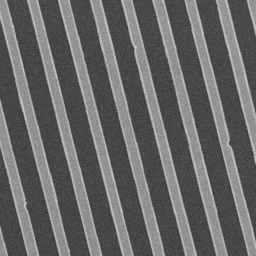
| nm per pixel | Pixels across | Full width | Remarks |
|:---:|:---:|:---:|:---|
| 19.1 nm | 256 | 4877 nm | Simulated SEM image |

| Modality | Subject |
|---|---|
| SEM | parallel lines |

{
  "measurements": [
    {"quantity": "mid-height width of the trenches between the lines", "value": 388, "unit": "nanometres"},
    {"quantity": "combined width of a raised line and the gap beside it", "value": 581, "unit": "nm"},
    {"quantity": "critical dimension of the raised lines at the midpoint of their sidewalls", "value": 194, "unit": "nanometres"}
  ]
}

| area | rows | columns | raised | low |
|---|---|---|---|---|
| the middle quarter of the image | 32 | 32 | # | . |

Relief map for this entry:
...##......##......##......##...
...###.....##......##......##...
...###.....###.....###.....##...
....##.....###.....###.....###..
....##......##......##......##..
....###.....##......##......##..
.....##.....###.....###.....##..
.....##.....###.....###.....###.
.....##......##......##.....###.
.....###.....##......##......##.
.....###.....###.....###.....##.
......##.....###.....###.....###
#.....##......##......##.....###
#.....###.....##......##......##
#.....###.....###.....###.....##
#......##.....###.....###.....##
##.....##......##......##.....##
##.....###.....##......##......#
##.....###.....###.....###.....#
##......##.....###.....###.....#
###.....##......##......##.....#
###.....###.....##......##......
###......##.....###.....###.....
.##......##.....###.....###.....
.###.....##......##......##.....
.###.....###.....##......##.....
..##.....###.....###.....##.....
..##......##.....###.....###....
..###.....##......##......##....
..###.....###.....##......##....
..###.....###.....###.....##....
...##......##.....###.....###...